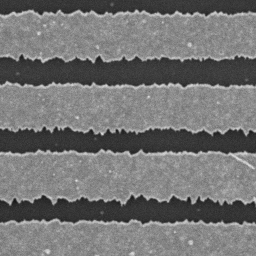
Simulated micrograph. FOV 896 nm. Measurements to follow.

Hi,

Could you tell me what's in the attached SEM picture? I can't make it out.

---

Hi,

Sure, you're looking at lines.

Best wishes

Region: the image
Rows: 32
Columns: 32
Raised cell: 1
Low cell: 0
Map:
00000000000000000000000000000000
00010001010100000100000000000000
11111111111111111111111111111111
11111111111111111111111111111111
11111111111111111111111111111111
11111111111111111111111111111111
11111111111111111111111111111111
00000100100101100000000000000000
00000000000000000000000000000000
00000000000000000000000000000000
11000010110000000000000000000000
11111111111111111111111111111111
11111111111111111111111111111111
11111111111111111111111111111111
11111111111111111111111111111111
11111111111111111111111111111111
00000000000010000100000010100010
00000000000000000000000000000000
00000000000000000000000000000000
11111111111111111111111111111111
11111111111111111111111111111111
11111111111111111111111111111111
11111111111111111111111111111111
11111111111111111111111111111111
11111111111111111111111111111111
00000000000000000000000000000000
00000000000000000000000000000000
00000000000000000000000000000000
11111111111111111111111111111111
11111111111111111111111111111111
11111111111111111111111111111111
11111111111111111111111111111111